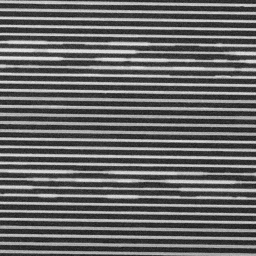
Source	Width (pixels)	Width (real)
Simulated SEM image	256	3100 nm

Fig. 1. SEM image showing parallel lines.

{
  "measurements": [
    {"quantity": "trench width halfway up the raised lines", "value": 6.25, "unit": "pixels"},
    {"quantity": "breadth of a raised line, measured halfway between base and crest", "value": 22.7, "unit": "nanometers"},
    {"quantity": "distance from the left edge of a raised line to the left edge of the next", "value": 8.05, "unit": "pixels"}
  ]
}